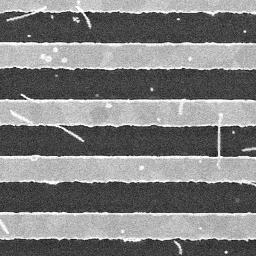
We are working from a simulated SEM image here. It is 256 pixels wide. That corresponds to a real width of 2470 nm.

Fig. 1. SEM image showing lines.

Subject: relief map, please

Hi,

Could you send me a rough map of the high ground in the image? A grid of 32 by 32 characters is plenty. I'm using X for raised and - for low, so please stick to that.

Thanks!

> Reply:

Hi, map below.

XXXXXXXXXXXXXXXXXXXXXXXXXXXXXXXX
X--XXXXX-XX-XX-XXXXXXXXXXXXXXXXX
--------------------------------
--------------------------------
--------------------------------
XXXXXXXXXXXX----XX--XXXX-XX--X--
XXXXXXXXXXXXXXXXXXXXXXXXXXXXXXXX
XXXXXXXXXXXXXXXXXXXXXXXXXXXXXXXX
X-XXX-XXXXXXXXXXXXXXXXXXXXXXXXXX
--------------------------------
--------------------------------
--------------------------------
X--X----X-------------X---------
XXXXXXXXXXXXXXXXXXXXXXXXXXXXXXXX
XXXXXXXXXXXXXXXXXXXXXXXXXXXXXXXX
XXXXXXXXXXXXXXXXXXXXXXXXXXXXXXXX
--------------------------------
--------------------------------
--------------------------------
----X----------------------X----
XXXXXXXXXXXXXXXXXXXXXXXXXXXXXXXX
XXXXXXXXXXXXXXXXXXXXXXXXXXXXXXXX
XXXXXXXXXXXXXXXXXXXXXXXXXXXXXXXX
--------------------------------
--------------------------------
--------------------------------
--------------------------------
XXXXXXXXXXXXXXXXXXXXXXXXXXXXXXXX
XXXXXXXXXXXXXXXXXXXXXXXXXXXXXXXX
XXXXXXXXXXXXXXXXXXXXXXXXXXXXXXXX
--------------------------------
--------------------------------